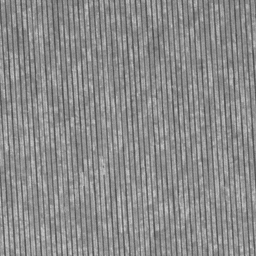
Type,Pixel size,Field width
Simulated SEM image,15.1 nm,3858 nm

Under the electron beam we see parallel lines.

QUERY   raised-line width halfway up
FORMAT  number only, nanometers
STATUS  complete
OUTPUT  47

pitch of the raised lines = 78.3 nanometres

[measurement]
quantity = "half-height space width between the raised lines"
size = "28.2 nm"